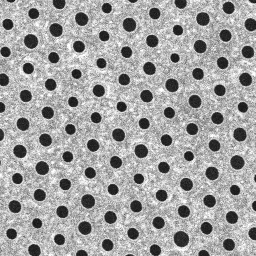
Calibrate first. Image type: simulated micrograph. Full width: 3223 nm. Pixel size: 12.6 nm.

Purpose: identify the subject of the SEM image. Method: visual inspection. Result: a regular array of holes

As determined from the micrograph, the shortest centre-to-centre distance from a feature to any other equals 344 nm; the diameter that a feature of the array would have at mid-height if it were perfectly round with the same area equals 153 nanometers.